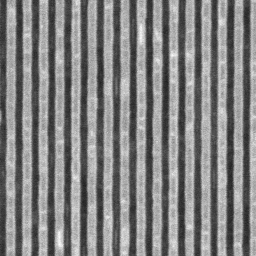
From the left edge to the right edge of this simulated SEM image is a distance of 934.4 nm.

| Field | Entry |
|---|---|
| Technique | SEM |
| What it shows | parallel lines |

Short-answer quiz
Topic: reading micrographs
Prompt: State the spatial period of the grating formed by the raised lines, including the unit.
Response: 16.2 px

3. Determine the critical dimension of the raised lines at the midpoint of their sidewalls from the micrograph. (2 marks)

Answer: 31.9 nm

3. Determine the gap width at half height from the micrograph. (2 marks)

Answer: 28.3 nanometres